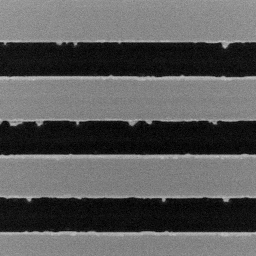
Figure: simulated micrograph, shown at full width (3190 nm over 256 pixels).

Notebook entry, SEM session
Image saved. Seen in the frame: lines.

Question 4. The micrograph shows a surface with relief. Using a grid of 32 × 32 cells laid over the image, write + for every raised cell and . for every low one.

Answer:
++++++++++++++++++++++++++++++++
++++++++++++++++++++++++++++++++
++++++++++++++++++++++++++++++++
++++++++++++++++++++++++++++++++
++++++++++++++++++++++++++++++++
................................
................................
................................
................................
................................
++++++++++++++++++++++++++++++++
++++++++++++++++++++++++++++++++
++++++++++++++++++++++++++++++++
++++++++++++++++++++++++++++++++
++++++++++++++++++++++++++++++++
................................
................................
................................
................................
..++++++++++++++++.++++++.++++++
++++++++++++++++++++++++++++++++
++++++++++++++++++++++++++++++++
++++++++++++++++++++++++++++++++
++++++++++++++++++++++++++++++++
++++++++++++++++++++++++++++++++
................................
................................
................................
................................
++++++++++++++++++++++++++++++++
++++++++++++++++++++++++++++++++
++++++++++++++++++++++++++++++++